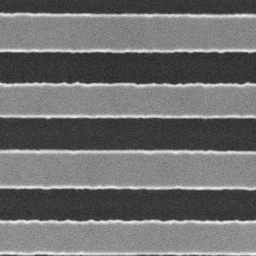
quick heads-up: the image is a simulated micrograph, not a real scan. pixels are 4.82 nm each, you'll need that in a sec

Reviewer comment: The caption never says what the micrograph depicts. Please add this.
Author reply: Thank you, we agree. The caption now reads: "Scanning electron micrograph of lines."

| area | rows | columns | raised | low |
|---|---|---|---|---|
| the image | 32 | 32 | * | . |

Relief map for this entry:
................................
................................
********************************
********************************
********************************
********************************
...............*.*.........*....
................................
................................
................................
*****************..**..***.**..*
********************************
********************************
********************************
********************************
................................
................................
................................
................................
********************************
********************************
********************************
********************************
********************************
................................
................................
................................
................................
********************************
********************************
********************************
********************************